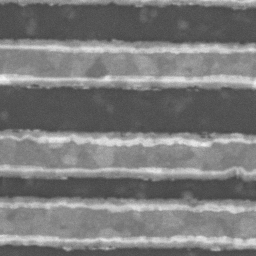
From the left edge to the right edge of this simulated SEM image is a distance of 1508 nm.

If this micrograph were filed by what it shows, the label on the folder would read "one or a few lines or trenches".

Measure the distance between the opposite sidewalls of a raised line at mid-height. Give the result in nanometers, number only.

191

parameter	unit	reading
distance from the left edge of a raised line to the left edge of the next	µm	0.468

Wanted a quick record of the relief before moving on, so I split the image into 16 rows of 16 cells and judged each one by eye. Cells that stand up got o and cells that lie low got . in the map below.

................
................
................
oooooooooooooooo
oooooooooooooooo
................
................
................
................
oooooooooooooooo
oooooooooooooooo
................
................
oooooooooooooooo
oooooooooooooooo
................